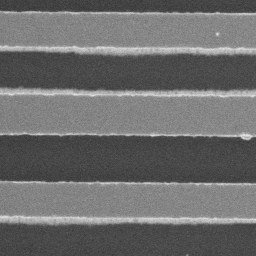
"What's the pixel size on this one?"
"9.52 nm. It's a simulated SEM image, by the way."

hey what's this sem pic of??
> lines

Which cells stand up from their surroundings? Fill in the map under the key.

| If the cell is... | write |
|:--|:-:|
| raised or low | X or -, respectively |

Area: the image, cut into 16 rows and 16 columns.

----------------
XXXXXXXXXXXXXXXX
XXXXXXXXXXXXXXXX
----------------
----------------
----------------
XXXXXXXXXXXXXXXX
XXXXXXXXXXXXXXXX
-------------XXX
----------------
----------------
XXXXXXXXXXXXXXXX
XXXXXXXXXXXXXXXX
XXXXXXXXXXXXXXXX
----------------
----------------